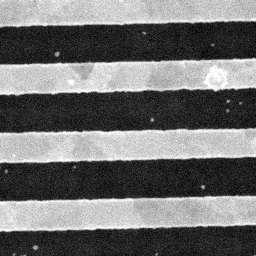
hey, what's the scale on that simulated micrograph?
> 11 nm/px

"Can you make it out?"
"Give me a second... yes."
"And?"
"lines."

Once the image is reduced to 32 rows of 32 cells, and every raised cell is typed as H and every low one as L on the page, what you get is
HHHHHHHHHHHHHHHHHHHHHHHHHHHHHHHH
HHHHHHHHHHHHHHHHHHHHHHHHHHHHHHHH
HHHHHHHHHHHHHHHHHHHHHHHHHHHHHHHH
LLLLLLLLLLLLLLLLLLLLLLLLLLLLLLLL
LLLLLLLLLLLLLLLLLLLLLLLLLLLLLLLL
LLLLLLLLLLLLLLLLLLLLLLLLLLLLLLLL
LLLLLLLLLLLLLLLLLLLLLLLLLLLLLLLL
LLLLLLLLLLLLLLLLLLLLLLLLLLLLLHHH
HHHHHHHHHHHHHHHHHHHHHHHHHHHHHHHH
HHHHHHHHHHHHHHHHHHHHHHHHHHHHHHHH
HHHHHHHHHHHHHHHHHHHHHHHHHHHHHHHH
HHHHHHHHLLLLLLLLLLLLLLLLLLLLLLLL
LLLLLLLLLLLLLLLLLLLLLLLLLLLLLLLL
LLLLLLLLLLLLLLLLLLLLLLLLLLLLLLLL
LLLLLLLLLLLLLLLLLLLLLLLLLLLLLLLL
LLLLLLLLLLLLLLLLLLLLLLLLLLLLLLLL
LLLLLLLLLLLHHLHHHHHHHHHHHHHHHHHH
HHHHHHHHHHHHHHHHHHHHHHHHHHHHHHHH
HHHHHHHHHHHHHHHHHHHHHHHHHHHHHHHH
HHHHHHHHHHHHHHHHHHHHHHHHHHHHHHHH
LLLLLLLLLLLLLLLLLLLLLLLLLLLLLLLL
LLLLLLLLLLLLLLLLLLLLLLLLLLLLLLLL
LLLLLLLLLLLLLLLLLLLLLLLLLLLLLLLL
LLLLLLLLLLLLLLLLLLLLLLLLLLLLLLLL
LLLLLLLLLLLLLLLLLLLLLLLLLLLLLLLL
HHHHHHHHHHHHHHHHHHHHHHHHHHHHHHHH
HHHHHHHHHHHHHHHHHHHHHHHHHHHHHHHH
HHHHHHHHHHHHHHHHHHHHHHHHHHHHHHHH
HHHHHHHHHHHHHHHHHLLLLLLLLLLLLLLL
LLLLLLLLLLLLLLLLLLLLLLLLLLLLLLLL
LLLLLLLLLLLLLLLLLLLLLLLLLLLLLLLL
LLLLLLLLLLLLLLLLLLLLLLLLLLLLLLLL